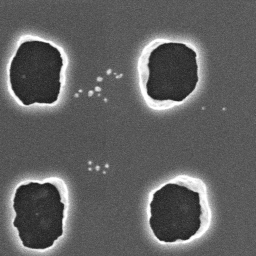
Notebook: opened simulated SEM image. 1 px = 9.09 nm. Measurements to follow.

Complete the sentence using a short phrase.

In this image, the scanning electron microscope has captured holes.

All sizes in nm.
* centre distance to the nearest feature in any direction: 1240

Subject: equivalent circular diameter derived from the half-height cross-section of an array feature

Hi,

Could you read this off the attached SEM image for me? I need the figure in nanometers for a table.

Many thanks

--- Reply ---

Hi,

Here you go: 553